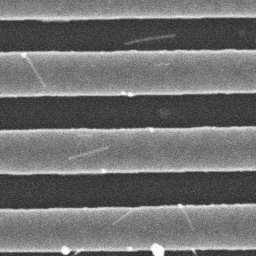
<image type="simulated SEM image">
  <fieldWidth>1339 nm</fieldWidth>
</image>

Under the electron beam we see lines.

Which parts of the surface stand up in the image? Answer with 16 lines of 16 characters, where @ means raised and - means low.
@@@@@@@@@@@@@@@@
----------------
----------------
@@@@@@@@@@@@@@@@
@@@@@@@@@@@@@@@@
@@@@@@@@@@@@@@@@
----------------
----------------
@@@@@@@@@@@@@@@@
@@@@@@@@@@@@@@@@
@@@@@@@@@@@@@@@@
----------------
----------------
@@@@@@@@@@@@@@@@
@@@@@@@@@@@@@@@@
@@@@@@@@@@@@@@@@